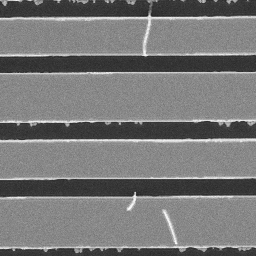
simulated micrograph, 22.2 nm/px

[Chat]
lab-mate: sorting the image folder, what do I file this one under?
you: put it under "lines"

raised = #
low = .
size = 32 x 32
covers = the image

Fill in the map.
................................
................................
################################
################################
################################
################################
################################
................................
................................
################################
################################
################################
################################
################################
################################
................................
................................
.###############################
################################
################################
################################
################################
................................
................................
................................
################################
################################
################################
################################
################################
################################
................................